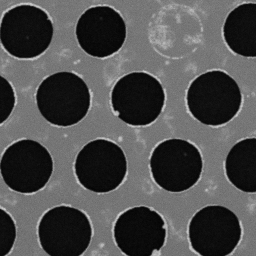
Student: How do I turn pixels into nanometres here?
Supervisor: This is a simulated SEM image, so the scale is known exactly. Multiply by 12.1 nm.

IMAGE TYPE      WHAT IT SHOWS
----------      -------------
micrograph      holes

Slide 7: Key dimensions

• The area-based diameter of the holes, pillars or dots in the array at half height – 639 nm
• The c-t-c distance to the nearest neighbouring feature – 905 nanometres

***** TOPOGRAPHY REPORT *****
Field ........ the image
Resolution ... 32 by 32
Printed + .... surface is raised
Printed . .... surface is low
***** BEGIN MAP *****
+++++++++++++++++++++++++++++++.
+....++++++....++++++++++++++...
......++++.....+++++++++++++....
.......+++......++++++++++++....
.......+++......++++++++++++....
......++++.....+++++++++++++....
+....++++++...+++++++++++++++...
++++++++++++++++++++++++++++++++
++++++++++++++++++++++++++++++++
++++++....++++++...++++++....+++
.++++......+++......++++......++
..+++......+++......+++.......++
..+++......+++.......++.......++
..+++......+++......++++......++
.++++......++++.....++++.....+++
+++++++..+++++++..++++++++..++++
++++++++++++++++++++++++++++++++
++++++++++++.++++++++..+++++++..
+.....++++.....++++.....+++++...
......++++......+++......+++....
.......+++......+++......+++....
.......+++......+++......+++....
+.....++++.....++++......++++...
+....++++++...++++++....++++++..
++++++++++++++++++++++++++++++++
++++++++++++++++++++++++++++++++
.+++++....++++++...++++++....+++
..+++......++++.....++++......++
..+++......+++.......+++......++
..+++......+++.......+++......++
..+++......++++.....++++......++
.+++++....+++++....++++++....+++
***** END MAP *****